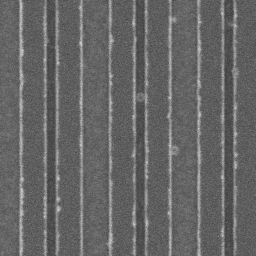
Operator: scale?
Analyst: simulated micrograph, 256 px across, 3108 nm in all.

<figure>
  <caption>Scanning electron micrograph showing parallel lines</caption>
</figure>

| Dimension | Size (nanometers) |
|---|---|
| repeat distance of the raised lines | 539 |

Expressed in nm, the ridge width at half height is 310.